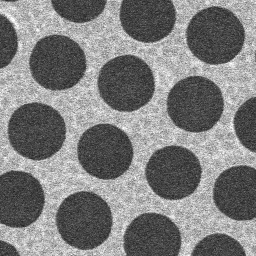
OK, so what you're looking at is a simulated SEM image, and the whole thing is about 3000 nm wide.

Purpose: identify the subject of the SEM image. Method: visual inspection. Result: a regular array of holes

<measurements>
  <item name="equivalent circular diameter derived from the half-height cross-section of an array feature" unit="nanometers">677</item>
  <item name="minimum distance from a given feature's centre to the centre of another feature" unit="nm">838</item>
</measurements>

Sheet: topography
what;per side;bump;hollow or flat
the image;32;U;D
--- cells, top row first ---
UUUUUUDDDDDDDUUDDDDDDDUUUUUUUUUU
UUUUUUUDDDDDDUUDDDDDDDUUUDDDDUUU
DUUUUUUUDDDUUUUDDDDDDDUUDDDDDDUU
DDUUUUUUUUUUUUUDDDDDDDUDDDDDDDUU
DDUUUUDDUUUUUUUUDDDDDUUDDDDDDDDU
DDUUDDDDDDUUUUUUUUUUUUUDDDDDDDUU
DDUUDDDDDDDUUUUUUUUUUUUUDDDDDDUU
DDUUDDDDDDDUUUDDDDUUUUUUUDDDDUUU
UUUUDDDDDDDUUDDDDDDUUUUUUUUUUUUU
UUUUDDDDDDUUDDDDDDDUUUUUDUUUUUUU
UUUUUDDDDDUUDDDDDDDUUUDDDDDUUUUU
UUUUUUUUUUUUDDDDDDDUUDDDDDDDUUUU
UUUUUUUUUUUUUDDDDDDUUDDDDDDDUUUD
UUDDDDDUUUUUUUDDDDUUUDDDDDDDUUDD
UDDDDDDDUUUUUUUUUUUUUDDDDDDDUDDD
UDDDDDDDUUUUDDUUUUUUUUDDDDDUUDDD
UDDDDDDDUUDDDDDDUUUUUUUUDUUUUDDD
UDDDDDDDUUDDDDDDUUUUUUUUUUUUUUDD
UUDDDDDDUUDDDDDDDUUUDDDUUUUUUUUD
UUUDDDDUUUDDDDDDDUUDDDDDUUUUUUUU
UUUUUUUUUUDDDDDDUUDDDDDDDUUUUUUU
UDDUUUUUUUUDDDDDUUDDDDDDDUUUDDDD
DDDDDUUUUUUUUDUUUUDDDDDDDUUDDDDD
DDDDDUUUUUUUUUUUUUUDDDDDDUUDDDDD
DDDDDDUUUDDDUUUUUUUUDDDDUUUDDDDD
DDDDDDUUDDDDDUUUUUUUUUUUUUUDDDDD
DDDDDUUDDDDDDDUUUUUUUUUUUUUUDDDD
DDDDDUUDDDDDDDUUUDDDDUUUUUUUUDDU
UUDUUUUDDDDDDDUUDDDDDDUUUUUUUUUU
UUUUUUUUDDDDDDUDDDDDDDDUUUDDDUUU
DUUUUUUUDDDDDUUDDDDDDDDUDDDDDDUU
DDUUUUUUUUUUUUUUDDDDDDUUDDDDDDDU